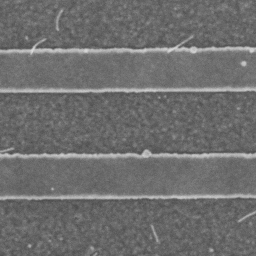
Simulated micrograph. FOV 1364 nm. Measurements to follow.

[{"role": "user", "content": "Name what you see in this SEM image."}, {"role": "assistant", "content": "lines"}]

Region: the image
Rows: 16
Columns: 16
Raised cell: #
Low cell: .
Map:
................
................
................
################
################
################
................
................
................
................
################
################
................
................
................
................